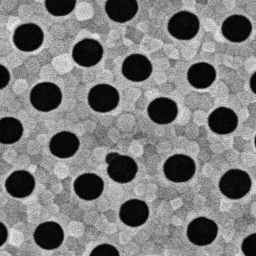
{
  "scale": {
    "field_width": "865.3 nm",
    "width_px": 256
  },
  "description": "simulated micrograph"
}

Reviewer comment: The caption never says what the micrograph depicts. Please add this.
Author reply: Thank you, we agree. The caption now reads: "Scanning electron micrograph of a regular array of holes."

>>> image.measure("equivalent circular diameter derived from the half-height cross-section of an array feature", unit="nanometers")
100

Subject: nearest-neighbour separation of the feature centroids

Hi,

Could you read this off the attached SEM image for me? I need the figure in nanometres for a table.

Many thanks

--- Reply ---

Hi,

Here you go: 170